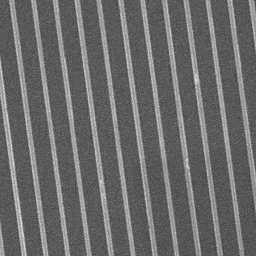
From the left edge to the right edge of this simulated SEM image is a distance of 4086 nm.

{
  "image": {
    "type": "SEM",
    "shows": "parallel lines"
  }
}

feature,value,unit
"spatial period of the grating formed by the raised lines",344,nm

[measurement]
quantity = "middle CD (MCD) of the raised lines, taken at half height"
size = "59.4 nanometres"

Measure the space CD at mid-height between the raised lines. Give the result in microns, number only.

0.281